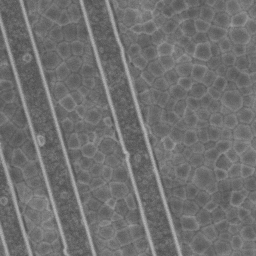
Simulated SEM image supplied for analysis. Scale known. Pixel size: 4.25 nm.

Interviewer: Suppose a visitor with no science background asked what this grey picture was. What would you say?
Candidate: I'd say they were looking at one or a few lines or trenches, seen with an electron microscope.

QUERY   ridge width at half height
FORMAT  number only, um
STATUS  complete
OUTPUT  0.107